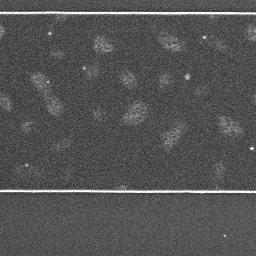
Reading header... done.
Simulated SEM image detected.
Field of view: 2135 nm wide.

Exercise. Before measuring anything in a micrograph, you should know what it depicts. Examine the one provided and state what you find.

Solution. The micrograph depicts one or a few lines or trenches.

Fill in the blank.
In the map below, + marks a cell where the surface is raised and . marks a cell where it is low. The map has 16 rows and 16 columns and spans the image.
................
++++++++++++++++
++++++++++++++++
++++++++++++++++
++++++++++++++++
++++++++++++++++
++++++++++++++++
++++++++++++++++
++++++++++++++++
++++++++++++++++
++++++++++++++++
++++++++++++++++
................
................
................
................